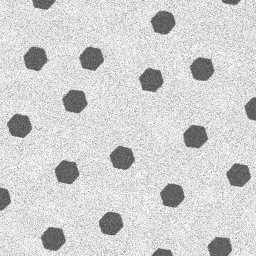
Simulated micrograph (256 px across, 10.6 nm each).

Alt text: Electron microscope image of a regular array of holes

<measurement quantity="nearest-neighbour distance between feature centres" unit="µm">0.612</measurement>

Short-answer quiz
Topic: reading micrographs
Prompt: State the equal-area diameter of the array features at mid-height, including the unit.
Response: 0.252 um